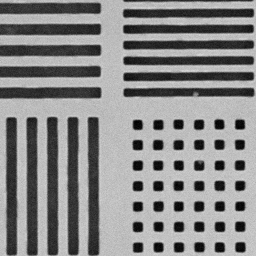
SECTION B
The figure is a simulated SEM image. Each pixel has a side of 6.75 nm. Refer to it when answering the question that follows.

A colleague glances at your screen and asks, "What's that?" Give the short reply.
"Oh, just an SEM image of groups of lines, slits or small figures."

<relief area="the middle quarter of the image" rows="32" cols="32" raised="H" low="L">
LLLLLLLLLHHHHHHHHHHHHHHHHHHHHHHH
LLLLLLLLLHHHHHHHHHHHHHHHHHHHHHHH
LLLLLLLLLHHHHHHLLLLLLLLLLLLLLLLL
LLLLLLLLLHHHHHHLLLLLLLLLLLLLLLLL
HHHHHHHHHHHHHHHHHHHHHHHHHHHHHHHH
HHHHHHHHHHHHHHHHHHHHHHHHHHHHHHHH
LLLLLLLLLLHHHHHLLLLLLLLLLLLLLLLL
LLLLLLLLLLHHHHHLLLLLLLLLLLLLLLLL
LLLLLLLLLHHHHHHHHHHHHHHHHHHHHHHH
HHHHHHHHHHHHHHHHHHHHHHHHHHHHHHHH
HHHHHHHHHHHHHHHHHHHHHHHHHHHHHHHH
HHHHHHHHHHHHHHHHHHHHHHHHHHHHHHHH
HHHHHHHHHHHHHHHHHHHHHHHHHHHHHHHH
HLLHHHLLLHHHHHHHHHHHHHHHHHHHHHHH
HLLLHHLLLHHHHHHHHLLLHHLLLHHLLLHH
HLLLHHLLLHHHHHHHHLLLHHLLLHHLLLHH
HLLLHHLLLHHHHHHHHHLHHHHLHHHHHHHH
HLLLHHLLLHHHHHHHHHHHHHHHHHHHHHHH
HLLLHHLLLHHHHHHHHHHHHHHHHHHHHHHH
HLLLHHLLLHHHHHHHHLLLHHLLLHHLLLHH
HLLLHHLLLHHHHHHHHLLLHHLLLHHLLLHH
HLLLHHLLLHHHHHHHHHLHHHHLHHHHLLHH
HLLLHHLLLHHHHHHHHHHHHHHHHHHHHHHH
HLLLHHLLLHHHHHHHHHHHHHHHHHHHHHHH
HLLLHHLLLHHHHHHHHLLLHHLLLHHHLLHH
HLLLHHLLLHHHHHHHHLLLHHLLLHHLLLHH
HLLLHHLLLHHHHHHHHLLLHHLLLHHHLLHH
HLLLHHLLLHHHHHHHHHHHHHHHHHHHHHHH
HLLLHHLLLHHHHHHHHHHHHHHHHHHHHHHH
HLLLHHLLLHHHHHHHHLLLHHLLLHHHLLHH
HLLLHHLLLHHHHHHHHLLLHHLLLHHLLLHH
HLLLHHLLLHHHHHHHHLLLHHLLLHHHLLHH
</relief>